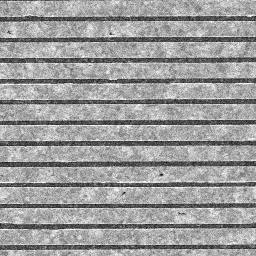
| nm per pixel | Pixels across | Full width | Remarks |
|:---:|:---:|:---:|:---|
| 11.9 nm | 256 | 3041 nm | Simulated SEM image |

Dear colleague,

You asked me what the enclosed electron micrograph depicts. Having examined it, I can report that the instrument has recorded parallel lines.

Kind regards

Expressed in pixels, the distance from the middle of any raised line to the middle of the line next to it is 20.7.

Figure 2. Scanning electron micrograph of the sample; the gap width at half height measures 59.4 nanometres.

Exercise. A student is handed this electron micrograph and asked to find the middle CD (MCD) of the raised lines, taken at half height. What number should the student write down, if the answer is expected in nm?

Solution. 183